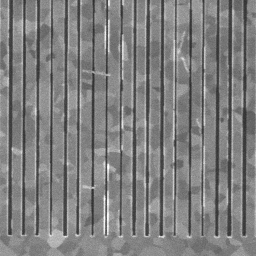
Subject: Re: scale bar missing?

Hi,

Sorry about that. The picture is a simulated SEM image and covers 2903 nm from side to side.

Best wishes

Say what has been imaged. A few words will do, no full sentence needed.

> parallel lines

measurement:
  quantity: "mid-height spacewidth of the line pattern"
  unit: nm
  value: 45.4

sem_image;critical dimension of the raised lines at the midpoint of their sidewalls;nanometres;113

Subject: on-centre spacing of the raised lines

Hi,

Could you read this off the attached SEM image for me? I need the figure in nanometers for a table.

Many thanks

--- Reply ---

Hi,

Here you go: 156